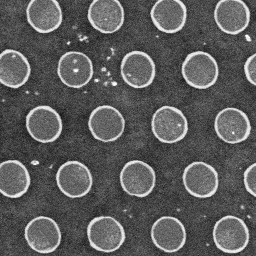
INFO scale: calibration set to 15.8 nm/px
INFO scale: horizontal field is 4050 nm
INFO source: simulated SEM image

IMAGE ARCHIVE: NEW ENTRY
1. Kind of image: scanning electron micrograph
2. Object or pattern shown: a regular array of raised bodies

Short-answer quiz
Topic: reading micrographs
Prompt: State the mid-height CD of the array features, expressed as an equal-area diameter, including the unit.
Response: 551 nanometres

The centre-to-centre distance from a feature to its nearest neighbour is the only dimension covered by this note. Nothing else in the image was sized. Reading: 987 nm